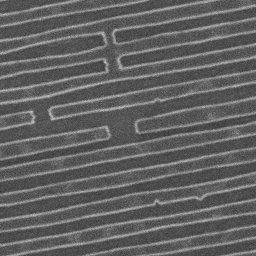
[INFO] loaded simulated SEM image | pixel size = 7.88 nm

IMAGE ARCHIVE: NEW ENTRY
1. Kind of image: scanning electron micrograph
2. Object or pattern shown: parallel lines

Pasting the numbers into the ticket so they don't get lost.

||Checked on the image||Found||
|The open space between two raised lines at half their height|12.4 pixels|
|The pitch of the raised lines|0.2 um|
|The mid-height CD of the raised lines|104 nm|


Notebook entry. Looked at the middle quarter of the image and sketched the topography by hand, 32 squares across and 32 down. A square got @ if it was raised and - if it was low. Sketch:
@----------@@@----@@@@@@@@@@@@@@
-----------@@@@@@@@@@@@@@@@@@@--
--------@@@@@@@@@@@@@@@---------
--@@@@@@@@@@@@@@@@--------------
@@@@@@@@@@----------------------
@@@@@@--------------------@@@@@@
@@-------------------@@@@@@@@@@@
---------------@@@@@@@@@@@@@@@@@
----------@@@@@@@@@@@@@@@@@-----
----@@@@@@@@@@@@@@@@@@----------
@@@@@@@@@@@@@@@@----------------
@@@@@@@@@@@-------------------@@
@@@@----------------------@@@@@@
----------------------@@@@@@@@@@
------------------@@@@@@@@@@@@@@
------------------@@@@@@@@@@@@@-
------@@@@@-------@@@@@@--------
@@@@@@@@@@@-------------------@@
@@@@@@@@@@@--------------@@@@@@@
@@@@@@@--------------@@@@@@@@@@@
@--------------@@@@@@@@@@@@@@@@@
----------@@@@@@@@@@@@@@@@@-----
----@@@@@@@@@@@@@@@@@-----------
@@@@@@@@@@@@@@@-----------------
@@@@@@@@@@-------------------@@@
@@@@@------------------@@@@@@@@@
------------------@@@@@@@@@@@@@@
------------@@@@@@@@@@@@@@@@----
------@@@@@@@@@@@@@@@@@@--------
@@@@@@@@@@@@@@@@@@@-------------
@@@@@@@@@@@@@@@-----------------
@@@@@@@@-----------------@@@@@@@